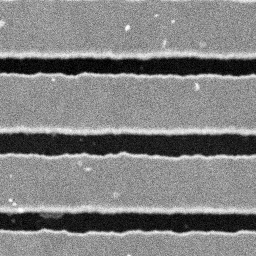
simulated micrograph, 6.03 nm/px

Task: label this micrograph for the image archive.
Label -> lines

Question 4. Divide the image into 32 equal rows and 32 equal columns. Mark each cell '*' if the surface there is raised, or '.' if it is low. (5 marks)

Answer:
********************************
********************************
********************************
********************************
********************************
********************************
********************************
................................
................................
*****************************.**
********************************
********************************
********************************
********************************
********************************
********************************
********************************
................................
................................
******.*************...***.*****
********************************
********************************
********************************
********************************
********************************
********************************
****..*****.********************
................................
................................
********************************
********************************
********************************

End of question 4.